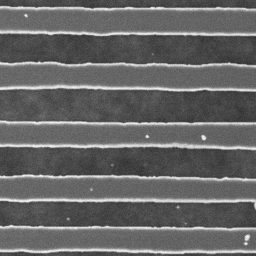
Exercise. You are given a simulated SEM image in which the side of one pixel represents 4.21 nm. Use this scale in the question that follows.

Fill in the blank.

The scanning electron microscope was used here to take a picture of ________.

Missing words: lines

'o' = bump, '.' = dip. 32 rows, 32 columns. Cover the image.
................................
oooooooooooooooooooooooooooooooo
oooooooooooooooooooooooooooooooo
oooooooooooooooooooooooooooooooo
................................
................................
................................
................................
oooooooooooooooooooooooooooooooo
oooooooooooooooooooooooooooooooo
oooooooooooooooooooooooooooooooo
................................
................................
................................
................................
oooooooooooooooooooooooooooooooo
oooooooooooooooooooooooooooooooo
oooooooooooooooooooooooooooooooo
...........................ooooo
................................
................................
................................
oooooooooooooooooooooooooooooooo
oooooooooooooooooooooooooooooooo
oooooooooooooooooooooooooooooooo
................................
................................
................................
oooooooooooooooooooooo..oo......
oooooooooooooooooooooooooooooooo
oooooooooooooooooooooooooooooooo
.....o.............oooooooo.o.o.